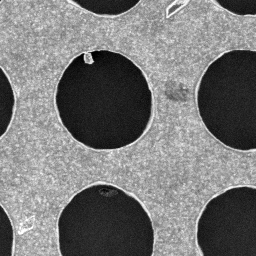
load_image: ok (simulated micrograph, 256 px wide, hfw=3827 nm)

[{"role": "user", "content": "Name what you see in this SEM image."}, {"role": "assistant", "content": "holes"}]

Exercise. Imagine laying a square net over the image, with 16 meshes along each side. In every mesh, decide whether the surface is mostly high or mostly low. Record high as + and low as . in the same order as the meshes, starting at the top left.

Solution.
+++++...++++++..
++++++++++++++++
++++++++++++++++
++++++..++++++..
++++.....++++...
.+++.....+++....
.+++......++....
.+++.....++++...
+++++....++++...
++++++++++++++++
++++++++++++++++
++++++++++++++++
++++.....++++...
++++.....++++...
.+++......++....
.+++......++....